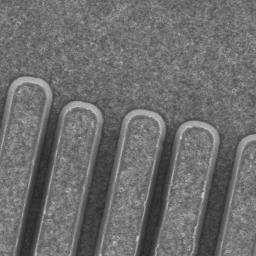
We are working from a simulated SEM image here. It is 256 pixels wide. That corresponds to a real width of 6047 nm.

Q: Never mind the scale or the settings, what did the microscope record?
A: parallel lines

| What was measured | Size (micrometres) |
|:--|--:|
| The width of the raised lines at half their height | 0.924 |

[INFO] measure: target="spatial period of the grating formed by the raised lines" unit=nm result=1380